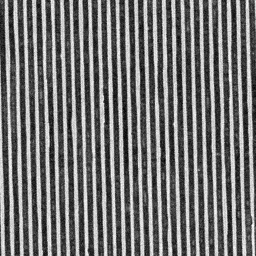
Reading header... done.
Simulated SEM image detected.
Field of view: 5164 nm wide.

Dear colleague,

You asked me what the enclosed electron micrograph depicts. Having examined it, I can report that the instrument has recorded parallel lines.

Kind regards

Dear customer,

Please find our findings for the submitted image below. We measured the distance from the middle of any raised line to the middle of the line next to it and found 0.187 um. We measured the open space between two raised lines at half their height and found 121 nm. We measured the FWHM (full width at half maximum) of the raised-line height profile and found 68 nanometres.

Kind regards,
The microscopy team